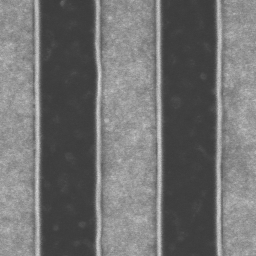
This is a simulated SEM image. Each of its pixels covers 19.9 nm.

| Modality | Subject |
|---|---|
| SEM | one or a few lines or trenches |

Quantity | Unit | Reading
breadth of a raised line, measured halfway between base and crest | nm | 1220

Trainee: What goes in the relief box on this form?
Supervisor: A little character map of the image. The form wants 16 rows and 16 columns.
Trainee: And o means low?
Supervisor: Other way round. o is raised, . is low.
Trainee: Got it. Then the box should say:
..oooo....oooo..
..oooo....oooo..
..oooo....oooo..
..oooo....oooo..
..oooo....oooo..
..oooo....oooo..
..oooo....oooo..
..oooo....oooo..
..oooo....oooo..
..oooo....oooo..
..oooo....oooo..
..oooo....oooo..
..oooo....oooo..
..oooo....oooo..
..oooo....oooo..
..oooo....oooo..